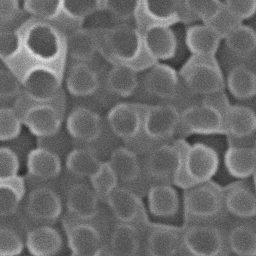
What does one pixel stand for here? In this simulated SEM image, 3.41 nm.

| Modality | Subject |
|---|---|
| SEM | a regular array of raised bodies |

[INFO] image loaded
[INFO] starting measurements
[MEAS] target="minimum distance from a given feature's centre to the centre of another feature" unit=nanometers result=82.6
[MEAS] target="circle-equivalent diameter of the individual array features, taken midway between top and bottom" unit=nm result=90.2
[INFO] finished